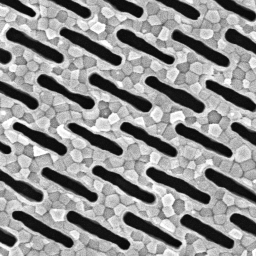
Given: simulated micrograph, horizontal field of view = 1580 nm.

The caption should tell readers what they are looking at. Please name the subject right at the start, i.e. a regular array of holes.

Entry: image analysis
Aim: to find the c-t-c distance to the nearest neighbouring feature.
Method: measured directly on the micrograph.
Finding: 321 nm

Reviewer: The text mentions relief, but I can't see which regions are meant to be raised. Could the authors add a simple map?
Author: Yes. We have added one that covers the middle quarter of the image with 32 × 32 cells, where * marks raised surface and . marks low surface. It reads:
********************************
********************************
*******.************************
******....***********..*********
******......********....********
********.....********......*****
.********......********.......**
....********.....********.......
*......******.......******......
**......*******.......******....
****....*********.....********..
*******************...**********
********************************
********************************
***************.****************
*...**********....**********..**
**....********......********....
***.....********.....********...
*****......*******......******..
******.......*******.....*******
*******.......*******......*****
.*********.....********.....****
************...**********...****
********************************
********************************
********.***********************
*******....**********...********
*******.......******......******
.********......*******.......***
....*******......******........*
.....********.....********......
*.....********......********....